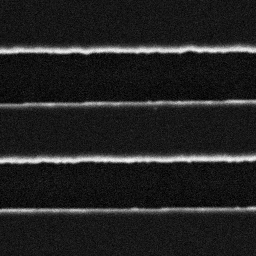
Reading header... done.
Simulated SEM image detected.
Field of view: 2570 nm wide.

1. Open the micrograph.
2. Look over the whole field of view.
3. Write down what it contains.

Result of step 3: lines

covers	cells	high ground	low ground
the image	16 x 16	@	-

@@@@@@@@@@@@@@@@
@@@@@@@@@@@@@@@@
@@@@@@@@@@@@@@@@
----------------
----------------
----------------
-@@@@@@@@@@@@@@@
@@@@@@@@@@@@@@@@
@@@@@@@@@@@@@@@@
@@@@@@@@@@@@@@@@
----------------
----------------
----------------
@@@@@@@@@@@@@@@@
@@@@@@@@@@@@@@@@
@@@@@@@@@@@@@@@@